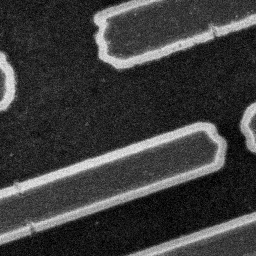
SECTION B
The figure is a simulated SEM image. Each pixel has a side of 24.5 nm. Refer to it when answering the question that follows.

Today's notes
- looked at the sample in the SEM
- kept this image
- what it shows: one or a few lines or trenches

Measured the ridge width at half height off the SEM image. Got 42.2 px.